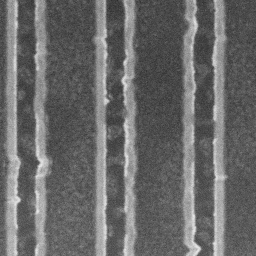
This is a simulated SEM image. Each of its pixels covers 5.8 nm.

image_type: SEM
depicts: one or a few lines or trenches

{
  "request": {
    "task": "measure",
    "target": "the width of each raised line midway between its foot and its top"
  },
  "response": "175 nm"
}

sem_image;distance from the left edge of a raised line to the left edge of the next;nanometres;515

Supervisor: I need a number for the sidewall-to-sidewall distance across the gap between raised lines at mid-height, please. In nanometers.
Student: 343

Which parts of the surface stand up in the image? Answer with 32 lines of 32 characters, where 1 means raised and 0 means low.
01111000000001110000000011100000
01111000000001110000000011100000
01111000000001110000000011100000
01111000000001110000000011100000
01111000000011110000000011110000
01111000000011110000000111110000
01111000000001110000000111100000
01111000000001110000000111100000
01111000000001110000000011100000
01111000000001110000000111100000
01111000000001110000000011100000
01111000000001110000000011100000
01111000000001110000000011100000
01111000000001110000000011100000
01111000000001110000000011100000
01111000000001110000000011100000
01111000000001110000000011100000
01111000000001110000000011100000
00111000000001110000000111100000
00111000000001110000000011100000
00111100000001110000000111100000
00111000000001110000000111100000
00111000000001110000000011110000
01111000000001110000000111100000
01111000000001110000000111100000
00111000000001110000000111100000
01111000000001110000000011100000
01111000000001110000000011100000
01111000000001110000000011100000
01111000000001110000000011100000
01111000000001110000000011100000
01111000000001110000000011100000